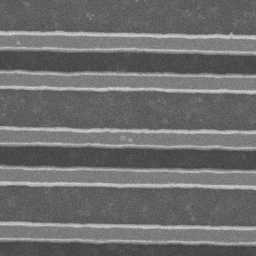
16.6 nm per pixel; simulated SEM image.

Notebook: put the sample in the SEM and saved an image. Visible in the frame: parallel lines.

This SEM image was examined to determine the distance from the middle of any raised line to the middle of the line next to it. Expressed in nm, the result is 793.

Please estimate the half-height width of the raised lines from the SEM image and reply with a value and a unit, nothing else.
16.9 px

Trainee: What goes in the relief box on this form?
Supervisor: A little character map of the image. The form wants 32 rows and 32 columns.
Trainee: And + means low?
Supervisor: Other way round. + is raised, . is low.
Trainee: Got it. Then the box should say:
................................
................................
................................
................................
++++++++++++++++++++++....++....
++++++++++++++++++++++++++++++++
......................++++++++++
................................
................................
+++++++++++++++++++++++++++++++.
++++++++++++++++++++++++++++++++
...............................+
................................
................................
................................
................................
+++++++++++++++++++++++++++..+.+
++++++++++++++++++++++++++++++++
...........................+++++
................................
................................
++++++++++++++++++++++++++++++++
++++++++++++++++++++++++++++++++
...............................+
................................
................................
................................
................................
++++++++++++++++++++++++++..+...
++++++++++++++++++++++++++++++++
...........................+++..
................................